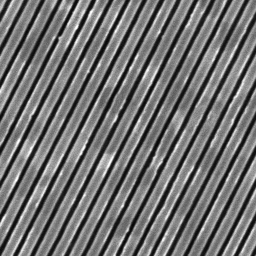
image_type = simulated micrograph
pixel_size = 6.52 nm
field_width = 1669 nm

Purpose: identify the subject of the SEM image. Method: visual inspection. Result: parallel lines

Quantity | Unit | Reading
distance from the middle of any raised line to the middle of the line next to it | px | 15.1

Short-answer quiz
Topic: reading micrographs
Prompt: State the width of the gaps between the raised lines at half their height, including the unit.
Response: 31.3 nm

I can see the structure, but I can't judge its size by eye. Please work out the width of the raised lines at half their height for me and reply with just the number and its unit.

67.6 nm